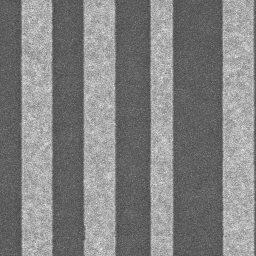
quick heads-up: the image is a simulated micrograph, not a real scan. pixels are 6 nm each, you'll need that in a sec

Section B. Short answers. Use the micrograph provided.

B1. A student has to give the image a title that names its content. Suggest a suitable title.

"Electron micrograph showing one or a few lines or trenches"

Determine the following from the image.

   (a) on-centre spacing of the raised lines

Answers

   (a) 403 nm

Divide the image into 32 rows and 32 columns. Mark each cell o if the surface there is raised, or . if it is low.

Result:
...ooo.....ooo.....oo.......oooo
...oooo....ooo.....oo.......oooo
...ooo.....ooo.....oo.......oooo
...oooo....ooo.....oo.......oooo
...ooo.....ooo.....oo.......oooo
...oooo....ooo.....oo.......oooo
...oooo....ooo.....oo.......oooo
...ooo.....ooo.....oo.......oooo
...ooo.....ooo.....oo.......oooo
...ooo.....ooo.....oo.......oooo
...ooo.....ooo.....oo.......oooo
...oooo....ooo.....oo.......oooo
...oooo....ooo.....oo.......oooo
...oooo....ooo.....oo.......oooo
...oooo....ooo.....oo.......oooo
...oooo....ooo.....oo.......oooo
...ooo.....ooo.....oo.......oooo
...ooo.....ooo.....oo.......oooo
...oooo....ooo.....oo.......oooo
...oooo....ooo.....oo.......oooo
...ooo.....ooo.....oo.......oooo
...oooo....ooo.....oo.......oooo
...oooo....ooo.....oo.......oooo
...ooo.....ooo.....oo.......oooo
...ooo.....ooo.....oo.......oooo
...oooo....ooo.....oo.......oooo
...oooo....ooo.....oo.......oooo
...ooo.....ooo.....oo.......oooo
...ooo.....ooo.....oo.......oooo
...oooo....ooo.....oo.......oooo
...oooo....ooo.....oo.......oooo
...oooo....ooo.....oo.......oooo